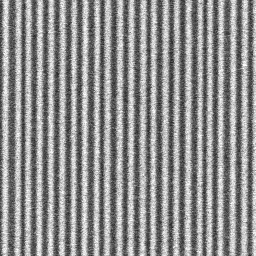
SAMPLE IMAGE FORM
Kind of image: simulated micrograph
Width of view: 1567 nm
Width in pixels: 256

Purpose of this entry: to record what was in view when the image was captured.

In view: parallel lines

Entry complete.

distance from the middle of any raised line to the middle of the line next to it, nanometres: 69.7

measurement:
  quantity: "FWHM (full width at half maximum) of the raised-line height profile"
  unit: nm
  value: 28.3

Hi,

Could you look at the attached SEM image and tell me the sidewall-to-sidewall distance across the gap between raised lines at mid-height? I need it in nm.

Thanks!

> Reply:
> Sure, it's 39.8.